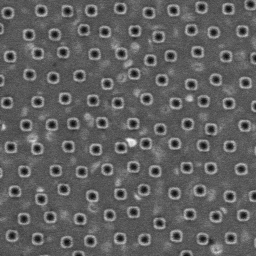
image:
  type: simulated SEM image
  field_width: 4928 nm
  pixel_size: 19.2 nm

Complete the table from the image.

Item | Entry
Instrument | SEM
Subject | a regular array of raised bodies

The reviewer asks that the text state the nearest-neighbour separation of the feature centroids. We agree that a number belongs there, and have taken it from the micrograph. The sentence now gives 441 nanometres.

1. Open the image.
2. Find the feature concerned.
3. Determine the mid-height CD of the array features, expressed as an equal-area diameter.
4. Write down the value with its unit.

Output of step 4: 232 nanometres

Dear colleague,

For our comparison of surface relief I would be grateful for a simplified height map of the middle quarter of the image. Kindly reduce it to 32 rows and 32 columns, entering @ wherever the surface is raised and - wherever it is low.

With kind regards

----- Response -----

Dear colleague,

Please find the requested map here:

--------------------------------
----------------@@@-------------
---@@-----------@@@-------------
---@@-----------@@@----@@@------
----------@@-----------@@@----@@
----------@@------------------@@
--------------------------------
@-------------------------------
@-----@@-----------@@@----------
@-----@@----@@@----@@@-----@@---
------------@@@------------@@---
--------------------------------
--------------------------------
---------@----------------------
-@@@----@@@-----@@@-----------@@
-@@@----@@@-----@@@----@@-----@@
-----------------------@@-------
-----------------------@@-------
--------------------------------
@@--------------@--@@@----@@@---
@@-----@@----@@@---@@@----@@@---
@@-----@@----@@@----------------
-------@@-----------------------
--------------------------------
----------------@@--------------
----------@@----@@@---@------@@@
---@@@----@@----@@@---@@-----@@@
---@@@----@@----------@@--------
--------------------------------
--------------------------------
@------------------@@-----------
@------------@@----@@-----@@@---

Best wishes